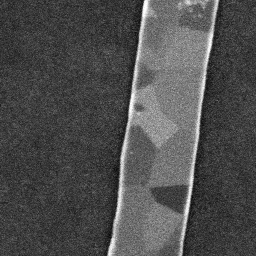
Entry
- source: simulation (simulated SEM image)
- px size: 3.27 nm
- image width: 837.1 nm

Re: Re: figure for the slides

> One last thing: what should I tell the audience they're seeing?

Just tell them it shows one or a few lines or trenches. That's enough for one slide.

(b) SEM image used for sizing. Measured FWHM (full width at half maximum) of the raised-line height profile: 230 nm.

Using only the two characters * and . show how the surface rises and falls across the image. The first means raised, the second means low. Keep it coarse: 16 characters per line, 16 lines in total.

.........*****..
.........****...
.........****...
.........****...
........*****...
........*****...
........*****...
........****....
........****....
........****....
........****....
........****....
.......*****....
.......*****....
.......*****....
.......****.....